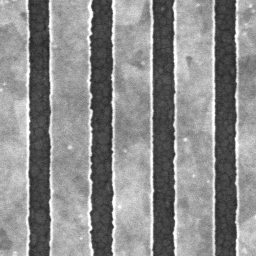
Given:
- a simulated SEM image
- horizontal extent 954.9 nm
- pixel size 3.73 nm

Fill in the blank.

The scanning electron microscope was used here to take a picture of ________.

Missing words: one or a few lines or trenches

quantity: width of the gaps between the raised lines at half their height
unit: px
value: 22.7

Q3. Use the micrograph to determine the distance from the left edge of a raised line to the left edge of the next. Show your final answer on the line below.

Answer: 0.231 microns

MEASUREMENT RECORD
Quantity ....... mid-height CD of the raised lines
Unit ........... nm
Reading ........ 147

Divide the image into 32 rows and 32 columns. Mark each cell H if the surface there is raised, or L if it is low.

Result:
HHHLLLHHHHHLLLHHHHHLLLHHHHHLLLHH
HHHLLLHHHHHHLLHHHHHLLLHHHHHLLLHH
HHHLLLHHHHHLLLHHHHHLLLHHHHHLLLHH
HHHHLLHHHHHLLLHHHHHLLLHHHHHLLLHH
HHHHLLHHHHHLLLHHHHHLLLHHHHHLLLHH
HHHLLLHHHHHLLLHHHHHLLLHHHHHLLLHH
HHHHLLHHHHHLLLHHHHHLLLHHHHHLLLHH
HHHHLLHHHHHLLLHHHHHLLLHHHHHLLLHH
HHHHLLHHHHHLLLHHHHHLLLHHHHHLLLHH
HHHHLLHHHHHLLLHHHHHLLLHHHHHLLLHH
HHHLLLHHHHHLLLHHHHHLLLHHHHHLLLHH
HHHLLLHHHHHLLLHHHHHLLLHHHHHLLLHH
HHHHLLHHHHHLLLHHHHHLLLHHHHHLLLHH
HHHLLLHHHHHLLLHHHHHLLLHHHHHLLLHH
HHHHLLHHHHHLLLHHHHHLLLHHHHHLLLHH
HHHHLLHHHHHLLLHHHHHLLLHHHHHLLLHH
HHHHLLHHHHHLLLHHHHHLLLHHHHHLLLHH
HHHLLLHHHHHLLLHHHHHLLLHHHHHLLHHH
HHHHLLHHHHHLLLHHHHHLLLHHHHHLLLHH
HHHHLLHHHHHLLLHHHHHLLLHHHHHLLLHH
HHHLLLHHHHHLLLHHHHHLLLHHHHHLLLHH
HHHLLLHHHHHLLLHHHHHLLLHHHHHLLLHH
HHHLLLHHHHHLLLHHHHHLLLHHHHHLLLHH
HHHLLLHHHHHLLLHHHHHLLLHHHHHLLLHH
HHHLLLHHHHHLLLHHHHHLLLHHHHHLLLHH
HHHLLLHHHHHLLLHHHHHLLLHHHHHLLLHH
HHHHLLHHHHHLLLHHHHHLLLHHHHHLLLHH
HHHLLLHHHHHLLLHHHHHLLLHHHHHLLLHH
HHHHLLHHHHHLLLHHHHHLLLHHHHHLLLHH
HHHHLLHHHHHLLLHHHHHLLLHHHHHLLLHH
HHHLLLHHHHHLLLHHHHHLLLHHHHHLLLHH
HHHLLLHHHHHHLLHHHHHLLLHHHHHLLLHH